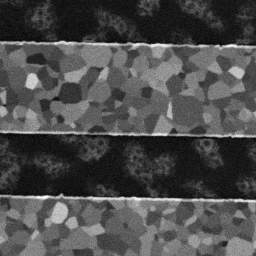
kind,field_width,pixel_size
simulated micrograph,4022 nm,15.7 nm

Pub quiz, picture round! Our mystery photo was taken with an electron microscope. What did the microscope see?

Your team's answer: one or a few lines or trenches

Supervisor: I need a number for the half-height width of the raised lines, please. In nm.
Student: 1420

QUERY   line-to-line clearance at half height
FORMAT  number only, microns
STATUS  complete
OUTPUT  1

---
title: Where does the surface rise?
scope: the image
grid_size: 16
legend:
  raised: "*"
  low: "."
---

................
................
................
****************
****************
****************
****************
****************
............**.*
................
................
................
*************.*.
****************
****************
****************